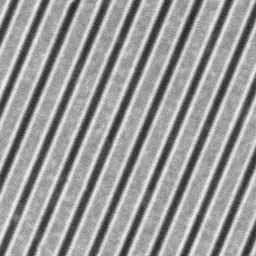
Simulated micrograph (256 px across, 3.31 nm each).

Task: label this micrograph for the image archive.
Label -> parallel lines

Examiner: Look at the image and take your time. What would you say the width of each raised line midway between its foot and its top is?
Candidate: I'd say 56.9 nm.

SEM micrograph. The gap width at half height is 37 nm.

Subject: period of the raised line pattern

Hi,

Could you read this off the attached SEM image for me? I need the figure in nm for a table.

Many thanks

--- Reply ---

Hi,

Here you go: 93.4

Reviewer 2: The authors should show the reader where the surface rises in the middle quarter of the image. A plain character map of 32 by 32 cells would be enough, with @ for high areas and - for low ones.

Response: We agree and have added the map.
@@---@@@@@---@@@@@---@@@@---@@@@
@@---@@@@----@@@@---@@@@@---@@@@
@----@@@@---@@@@@---@@@@----@@@@
@---@@@@@---@@@@----@@@@---@@@@@
----@@@@---@@@@@---@@@@@---@@@@-
---@@@@@---@@@@----@@@@---@@@@@-
---@@@@---@@@@@---@@@@@---@@@@--
---@@@@---@@@@@---@@@@---@@@@@--
--@@@@@---@@@@----@@@@---@@@@@--
--@@@@---@@@@@---@@@@@---@@@@---
-@@@@@---@@@@----@@@@---@@@@@---
-@@@@---@@@@@---@@@@@---@@@@---@
@@@@@---@@@@@---@@@@---@@@@@---@
@@@@----@@@@---@@@@@---@@@@@---@
@@@@---@@@@@---@@@@----@@@@---@@
@@@@---@@@@----@@@@---@@@@@---@@
@@@---@@@@@---@@@@@---@@@@---@@@
@@@---@@@@----@@@@---@@@@@---@@@
@@---@@@@@---@@@@@---@@@@----@@@
@@---@@@@@---@@@@---@@@@@---@@@@
@@---@@@@---@@@@@---@@@@@---@@@@
@---@@@@@---@@@@@---@@@@---@@@@@
@---@@@@---@@@@@---@@@@@---@@@@-
---@@@@@---@@@@@---@@@@---@@@@@-
---@@@@@---@@@@---@@@@@---@@@@--
---@@@@---@@@@@---@@@@@---@@@@--
--@@@@@---@@@@----@@@@---@@@@@--
--@@@@----@@@@---@@@@@---@@@@---
-@@@@@---@@@@@---@@@@---@@@@@---
-@@@@----@@@@---@@@@@---@@@@@---
@@@@@---@@@@@---@@@@----@@@@---@
@@@@@---@@@@---@@@@@---@@@@@---@